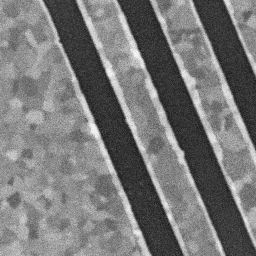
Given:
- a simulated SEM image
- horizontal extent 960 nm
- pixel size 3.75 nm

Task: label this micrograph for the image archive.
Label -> one or a few lines or trenches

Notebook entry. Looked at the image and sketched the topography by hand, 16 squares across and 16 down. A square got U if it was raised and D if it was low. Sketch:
UUUDDUUDDDUUDDUU
UUUDDUUUDDUUDDDU
UUUUDDUUDDDUUDDU
UUUUDDUUUDDUUDDD
UUUUDDDUUDDUUUDD
UUUUUDDUUUDDUUDD
UUUUUDDDUUDDUUUD
UUUUUUDDUUDDDUUD
UUUUUUDDUUUDDUUD
UUUUUUUDDUUDDDUU
UUUUUUUDDUUUDDUU
UUUUUUUDDDUUDDUU
UUUUUUUUDDUUDDDU
UUUUUUUUDDDUUDDU
UUUUUUUUUDDUUDDD
UUUUUUUUUDDUUUDD